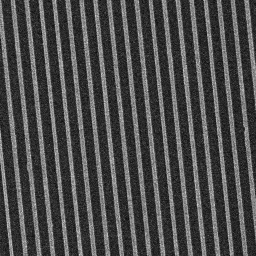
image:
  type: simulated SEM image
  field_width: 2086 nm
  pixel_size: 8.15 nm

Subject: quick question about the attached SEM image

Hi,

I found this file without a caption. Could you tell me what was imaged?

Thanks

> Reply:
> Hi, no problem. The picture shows parallel lines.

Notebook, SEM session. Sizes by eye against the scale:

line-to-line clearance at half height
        80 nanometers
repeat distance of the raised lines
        13.7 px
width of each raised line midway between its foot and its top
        3.85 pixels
